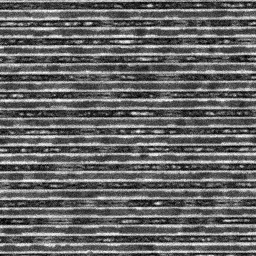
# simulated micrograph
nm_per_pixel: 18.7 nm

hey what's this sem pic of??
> parallel lines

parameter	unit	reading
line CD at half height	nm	161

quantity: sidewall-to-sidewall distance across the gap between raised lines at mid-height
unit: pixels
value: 9.5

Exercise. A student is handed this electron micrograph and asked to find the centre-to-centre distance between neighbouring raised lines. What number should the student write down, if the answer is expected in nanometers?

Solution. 336